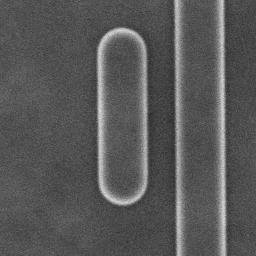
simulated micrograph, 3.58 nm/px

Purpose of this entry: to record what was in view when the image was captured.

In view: groups of lines, slits or small figures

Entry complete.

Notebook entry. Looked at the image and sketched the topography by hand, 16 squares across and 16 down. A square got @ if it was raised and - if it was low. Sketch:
-----------@@@--
-----------@@@--
------@@@--@@@--
------@@@--@@@--
------@@@--@@@--
------@@@--@@@--
------@@@--@@@--
------@@@--@@@--
------@@@--@@@--
------@@@--@@@--
------@@@--@@@--
------@@@--@@@--
-------@---@@@--
-----------@@@--
-----------@@@--
-----------@@@--